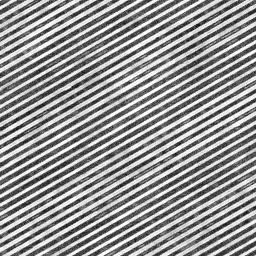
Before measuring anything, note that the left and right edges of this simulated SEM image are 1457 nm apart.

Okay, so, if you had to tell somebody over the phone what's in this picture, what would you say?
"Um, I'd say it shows parallel lines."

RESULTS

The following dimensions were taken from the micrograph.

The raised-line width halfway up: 19.2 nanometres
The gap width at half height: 29.1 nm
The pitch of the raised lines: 0.0443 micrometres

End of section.